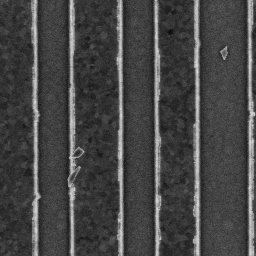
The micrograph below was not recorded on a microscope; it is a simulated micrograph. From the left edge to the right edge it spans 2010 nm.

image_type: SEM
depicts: one or a few lines or trenches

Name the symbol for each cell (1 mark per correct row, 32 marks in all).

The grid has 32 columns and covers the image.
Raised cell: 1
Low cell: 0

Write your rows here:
11110000011111100000111110000001
11110000011111100000111110000001
11110000011111100000111110000001
11110000011111100000111110000001
11110000011111100000111110000001
11110000011111100000111110000001
11110000011111100000111110000001
11110000011111100000111110000001
11110000011111100000111110000001
11110000011111100000111110000001
11110000011111100000111110000001
11110000011111100000111110000001
11110000011111100000111110000001
11110000011111100000111110000001
11111000011111100000111110000001
11110000011111100000111110000001
11110000011111100000111110000001
11110000011111100000111110000001
11110000011111100000111110000001
11110000011111100000111110000001
11110000011111100000111110000001
11110000011111100000111110000001
11110000011111100000111110000001
11110000011111100000111110000001
11111000011111100000111110000001
11110000011111100000111110000001
11110000011111100000111110000001
11110000011111100000111110000001
11111000011111100000111110000001
11111000011111100000111110000001
11111000011111100000111110000001
11111000011111100000111110000001